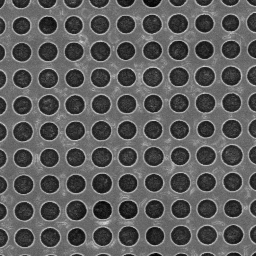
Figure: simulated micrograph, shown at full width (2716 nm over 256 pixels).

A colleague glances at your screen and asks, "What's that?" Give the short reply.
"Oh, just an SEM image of a regular array of holes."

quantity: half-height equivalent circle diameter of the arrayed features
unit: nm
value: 200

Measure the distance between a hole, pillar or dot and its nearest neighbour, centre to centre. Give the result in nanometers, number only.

276